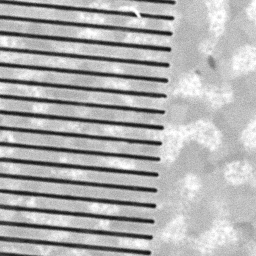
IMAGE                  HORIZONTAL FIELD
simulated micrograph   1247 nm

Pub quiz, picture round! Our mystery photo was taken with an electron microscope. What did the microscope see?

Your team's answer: parallel lines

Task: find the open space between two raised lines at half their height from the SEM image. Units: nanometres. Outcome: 24.2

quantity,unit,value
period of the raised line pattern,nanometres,76.6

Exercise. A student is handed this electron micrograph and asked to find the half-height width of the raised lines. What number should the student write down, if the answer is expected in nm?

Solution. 52.7